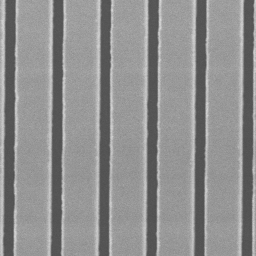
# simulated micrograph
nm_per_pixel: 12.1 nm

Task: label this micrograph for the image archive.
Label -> lines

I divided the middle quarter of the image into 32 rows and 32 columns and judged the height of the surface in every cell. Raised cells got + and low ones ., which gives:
+++++++++...+++++++++...++++++++
+++++++++...+++++++++...++++++++
+++++++++...+++++++++...++++++++
+++++++++...+++++++++...++++++++
+++++++++...+++++++++...++++++++
+++++++++...+++++++++...++++++++
+++++++++...+++++++++...++++++++
+++++++++...+++++++++...++++++++
+++++++++...+++++++++...++++++++
+++++++++...+++++++++..+++++++++
+++++++++...+++++++++..+++++++++
+++++++++...+++++++++...++++++++
+++++++++...+++++++++...++++++++
+++++++++...+++++++++...++++++++
+++++++++...+++++++++...++++++++
+++++++++...+++++++++..+++++++++
+++++++++...+++++++++...++++++++
+++++++++...+++++++++...++++++++
+++++++++...+++++++++...++++++++
+++++++++...+++++++++..+++++++++
+++++++++..++++++++++..+++++++++
+++++++++...+++++++++..+++++++++
+++++++++...+++++++++..+++++++++
+++++++++...+++++++++..+++++++++
+++++++++..++++++++++..+++++++++
+++++++++..++++++++++..+++++++++
+++++++++..++++++++++..+++++++++
+++++++++..++++++++++..+++++++++
+++++++++..++++++++++..+++++++++
+++++++++..++++++++++...++++++++
+++++++++..++++++++++..+++++++++
+++++++++..++++++++++..+++++++++